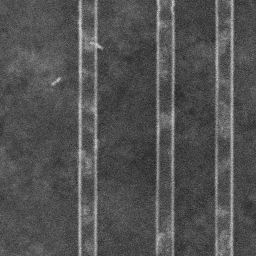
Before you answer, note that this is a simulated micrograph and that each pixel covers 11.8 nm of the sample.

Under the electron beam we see one or a few lines or trenches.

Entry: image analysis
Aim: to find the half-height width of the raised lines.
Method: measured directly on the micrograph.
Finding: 15.5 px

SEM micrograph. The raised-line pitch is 804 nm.